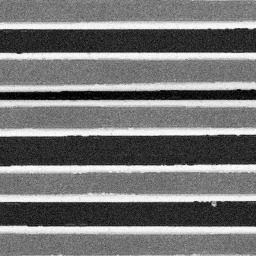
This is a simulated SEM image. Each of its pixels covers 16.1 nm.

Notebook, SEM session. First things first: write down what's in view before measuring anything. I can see lines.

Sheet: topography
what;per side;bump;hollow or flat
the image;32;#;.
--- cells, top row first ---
################################
################################
################################
................................
................................
................................
................................
################################
################################
################################
################################
................................
................................
################################
################################
################################
###############################.
................................
................................
................................
................................
################################
################################
################################
################################
................................
................................
................................
................................
################################
################################
################################